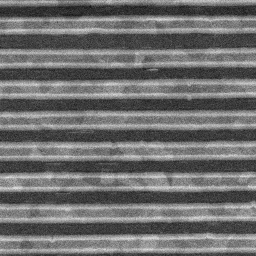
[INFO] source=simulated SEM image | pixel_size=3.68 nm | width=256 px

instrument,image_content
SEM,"parallel lines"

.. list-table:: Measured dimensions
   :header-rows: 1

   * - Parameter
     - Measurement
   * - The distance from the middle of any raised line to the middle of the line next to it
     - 115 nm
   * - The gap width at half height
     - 15.6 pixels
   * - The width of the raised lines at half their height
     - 53.8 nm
